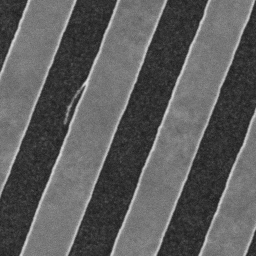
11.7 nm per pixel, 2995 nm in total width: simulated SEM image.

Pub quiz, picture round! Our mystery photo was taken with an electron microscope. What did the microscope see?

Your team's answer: lines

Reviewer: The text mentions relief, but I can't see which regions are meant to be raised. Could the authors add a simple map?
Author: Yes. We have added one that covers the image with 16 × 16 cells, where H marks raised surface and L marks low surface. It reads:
LLHHHLLHHHLLLHHH
LHHHLLLHHHLLHHHL
LHHHLLHHHLLLHHHL
HHHLLLHHHLLLHHHL
HHHLLLHHHLLHHHLL
HHHLLHHHLLLHHHLL
HHLLLHHHLLLHHLLL
HHLLHHHLLLHHHLLL
HLLLHHHLLLHHHLLH
HLLLHHHLLHHHLLLH
HLLHHHLLLHHHLLLH
LLLHHHLLLHHLLLHH
LLLHHHLLHHHLLLHH
LLHHHLLLHHHLLHHH
LLHHHLLHHHLLLHHH
LHHHLLLHHHLLLHHH